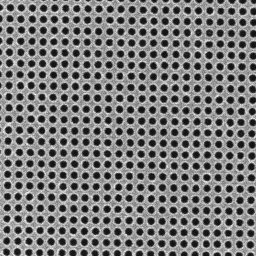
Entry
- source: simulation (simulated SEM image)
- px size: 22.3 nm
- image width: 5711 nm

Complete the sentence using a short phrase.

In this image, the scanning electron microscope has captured a regular array of holes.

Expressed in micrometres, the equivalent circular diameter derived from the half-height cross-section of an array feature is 0.171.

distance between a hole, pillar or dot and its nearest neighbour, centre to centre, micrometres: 0.24